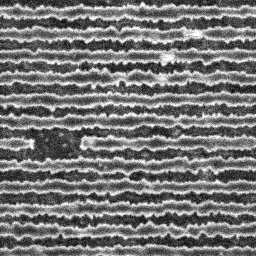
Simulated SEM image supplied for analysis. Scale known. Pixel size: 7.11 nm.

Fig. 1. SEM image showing parallel lines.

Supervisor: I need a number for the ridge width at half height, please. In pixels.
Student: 11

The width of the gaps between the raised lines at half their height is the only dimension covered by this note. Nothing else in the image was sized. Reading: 0.0782 microns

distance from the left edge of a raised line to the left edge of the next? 0.155 micrometres